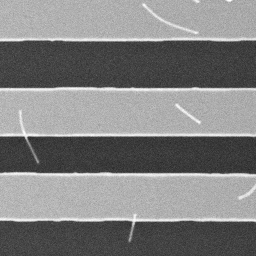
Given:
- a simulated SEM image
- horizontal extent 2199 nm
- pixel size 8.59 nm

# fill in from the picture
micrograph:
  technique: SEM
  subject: lines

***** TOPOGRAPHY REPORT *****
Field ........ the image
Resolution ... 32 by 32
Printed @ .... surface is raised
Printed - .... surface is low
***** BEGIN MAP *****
@@@@@@@@@@@@@@@@@@@@@@@@@@@@@@@@
@@@@@@@@@@@@@@@@@@@@@@@@@@@@@@@@
@@@@@@@@@@@@@@@@@@@@@@@@@@@@@@@@
@@@@@@@@@@@@@@@@@@@@@@@@@@@@@@@@
@@@@@@@@@@@@@@@@@@@@@@@@@@@@@@@@
--------------------------------
--------------------------------
--------------------------------
--------------------------------
--------------------------------
--------------------------------
@@@@@@@@@@@@@@@@@@@@@@@@@@@@@@@@
@@@@@@@@@@@@@@@@@@@@@@@@@@@@@@@@
@@@@@@@@@@@@@@@@@@@@@@@@@@@@@@@@
@@@@@@@@@@@@@@@@@@@@@@@@@@@@@@@@
@@@@@@@@@@@@@@@@@@@@@@@@@@@@@@@@
@@@@@@@@@@@@@@@@@@@@@@@@@@@@@@@@
--------------------------------
--------------------------------
--------------------------------
--------------------------------
--------------------------------
@@@@@@@@@@@@@@@@@@@@@@@@@@@@@@@@
@@@@@@@@@@@@@@@@@@@@@@@@@@@@@@@@
@@@@@@@@@@@@@@@@@@@@@@@@@@@@@@@@
@@@@@@@@@@@@@@@@@@@@@@@@@@@@@@@@
@@@@@@@@@@@@@@@@@@@@@@@@@@@@@@@@
-@@@@-@@-@@@@---@@@@@@@-@@@@@@@@
--------------------------------
--------------------------------
--------------------------------
--------------------------------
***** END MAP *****